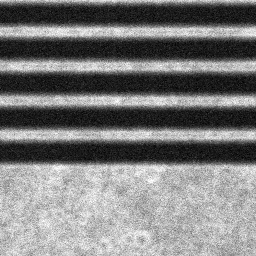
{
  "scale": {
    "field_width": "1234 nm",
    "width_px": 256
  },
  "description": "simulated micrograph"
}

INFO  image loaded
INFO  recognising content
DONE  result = parallel lines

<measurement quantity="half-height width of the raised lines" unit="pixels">11.5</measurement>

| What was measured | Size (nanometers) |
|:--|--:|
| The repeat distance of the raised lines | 166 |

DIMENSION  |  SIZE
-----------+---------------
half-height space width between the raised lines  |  112 nm